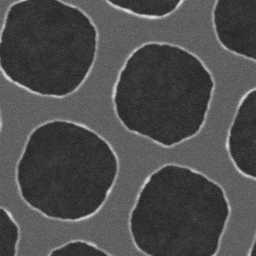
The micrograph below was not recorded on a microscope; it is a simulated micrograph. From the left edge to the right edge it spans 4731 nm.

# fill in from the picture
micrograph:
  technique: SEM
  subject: holes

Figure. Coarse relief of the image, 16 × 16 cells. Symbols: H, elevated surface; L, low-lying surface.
HLLLLHHHLLLHHLLL
LLLLLLHHHHHHHLLL
LLLLLLHHHHHHHHLL
LLLLLLHHLLLLHHHL
LLLLLHHHLLLLLHHH
HHLLLHHLLLLLLHHH
HHHHHHHLLLLLLHHL
HHHHHHHHLLLLLHHL
HHLLLLHHHLLLHHLL
HHLLLLLHHHHHHHLL
HLLLLLLHHHLLHHHL
HLLLLLLHHLLLLHHH
HHLLLLHHHLLLLLHH
LHHLLHHHLLLLLLHH
LHHHHHHHLLLLLLHH
LHHHLLHHHLLLLLHH